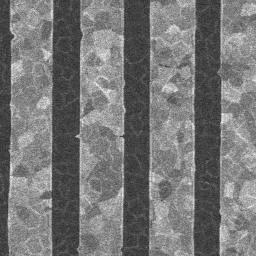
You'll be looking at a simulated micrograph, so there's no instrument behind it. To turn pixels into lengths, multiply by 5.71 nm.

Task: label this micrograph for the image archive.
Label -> one or a few lines or trenches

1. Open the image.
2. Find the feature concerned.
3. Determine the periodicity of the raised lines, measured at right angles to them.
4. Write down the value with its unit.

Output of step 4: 401 nm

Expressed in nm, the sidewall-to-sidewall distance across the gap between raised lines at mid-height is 158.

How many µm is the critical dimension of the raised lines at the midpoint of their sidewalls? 0.23